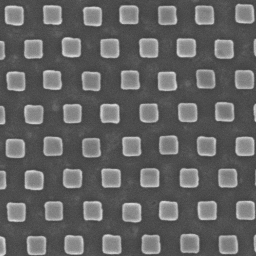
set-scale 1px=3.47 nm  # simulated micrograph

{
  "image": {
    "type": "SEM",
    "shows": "a regular array of raised bodies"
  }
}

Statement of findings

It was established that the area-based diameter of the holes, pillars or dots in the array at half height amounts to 0.0702 um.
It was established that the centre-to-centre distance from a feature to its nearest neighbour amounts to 128 nanometers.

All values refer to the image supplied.